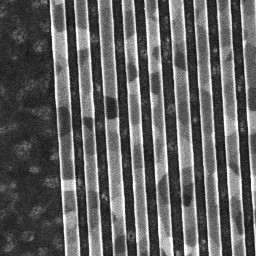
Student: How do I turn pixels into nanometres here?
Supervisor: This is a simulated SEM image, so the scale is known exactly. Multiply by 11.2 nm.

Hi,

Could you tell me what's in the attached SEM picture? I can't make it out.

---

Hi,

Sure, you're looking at parallel lines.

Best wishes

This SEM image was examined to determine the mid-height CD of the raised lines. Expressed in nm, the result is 146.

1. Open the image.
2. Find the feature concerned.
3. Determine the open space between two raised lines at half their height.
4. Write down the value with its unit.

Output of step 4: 123 nanometres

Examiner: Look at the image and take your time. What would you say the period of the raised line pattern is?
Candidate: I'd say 266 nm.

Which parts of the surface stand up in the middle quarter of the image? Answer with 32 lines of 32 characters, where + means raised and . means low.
+...+++...+++...++...+++...++++.
+...+++...+++...++...+++...++++.
+...+++...+++...+++..+++...++++.
+...+++...+++...+++...++....+++.
+...+++...+++...+++...++....+++.
+...+++...+++...+++...++....+++.
+...+++...+++...+++...+++...+++.
++..+++...+++...+++...+++...+++.
++..+++...+++...+++...+++...+++.
++..+++...+++...+++...+++...+++.
+...+++...+++...+++...+++...+++.
++..++++..++++..+++...+++...+++.
++..+++...++++..+++...+++...+++.
++..+++...++++..+++...+++...+++.
++...++...+++...+++...+++...++++
++...+++...+++...++...+++...++++
++...+++...+++...++...+++...++++
++...+++...+++...++...+++...++++
++...+++...+++...+++..+++...++++
++...+++...+++...+++...++....+++
++...+++...+++...+++...++....+++
++...+++...+++...+++...++....+++
++...+++...+++...+++...+++...+++
++...+++...+++...+++...+++...+++
++...+++...+++...+++...+++...+++
++...+++...+++...+++...+++...+++
++...+++...+++...+++...+++...+++
+++..+++...++++..+++...+++...+++
+++..+++...++++..+++...+++...+++
+++..+++...++++..+++...+++...+++
+++...++...++++..+++...+++...+++
+++...+++..++++..+++...+++...+++